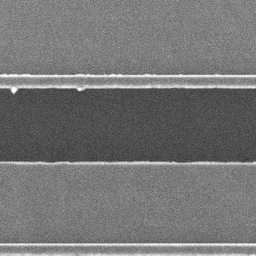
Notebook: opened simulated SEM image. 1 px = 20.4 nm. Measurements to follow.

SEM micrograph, lines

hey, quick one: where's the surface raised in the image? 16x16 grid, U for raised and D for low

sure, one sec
UUUUUUUUUUUUUUUU
UUUUUUUUUUUUUUUU
UUUUUUUUUUUUUUUU
UUUUUUUUUUUUUUUU
UUUUUUUUUUUUUUUU
UDDDDUDDDDDDDDDD
DDDDDDDDDDDDDDDD
DDDDDDDDDDDDDDDD
DDDDDDDDDDDDDDDD
DDDDDDDDDDDDDDDD
UUUUUUUUUUUUUUUU
UUUUUUUUUUUUUUUU
UUUUUUUUUUUUUUUU
UUUUUUUUUUUUUUUU
UUUUUUUUUUUUUUUU
UUUUUUUUUUUUUUUU